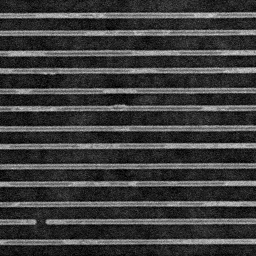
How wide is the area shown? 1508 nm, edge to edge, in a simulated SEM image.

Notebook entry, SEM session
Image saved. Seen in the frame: parallel lines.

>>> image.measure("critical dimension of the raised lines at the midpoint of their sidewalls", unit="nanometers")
22.1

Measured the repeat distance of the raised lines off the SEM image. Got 18.9 px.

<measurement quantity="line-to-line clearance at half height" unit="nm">84.3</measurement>